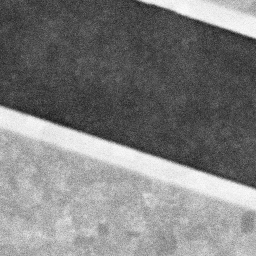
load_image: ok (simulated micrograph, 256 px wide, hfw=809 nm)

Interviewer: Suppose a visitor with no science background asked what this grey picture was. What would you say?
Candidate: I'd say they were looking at one or a few lines or trenches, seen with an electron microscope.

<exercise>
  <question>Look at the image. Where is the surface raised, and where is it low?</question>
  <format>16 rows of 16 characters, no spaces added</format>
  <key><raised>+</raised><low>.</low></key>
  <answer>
............++++
...............+
................
................
................
................
................
+...............
++++............
+++++++.........
++++++++++......
+++++++++++++...
++++++++++++++++
++++++++++++++++
++++++++++++++++
++++++++++++++++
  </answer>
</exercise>